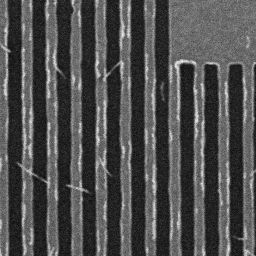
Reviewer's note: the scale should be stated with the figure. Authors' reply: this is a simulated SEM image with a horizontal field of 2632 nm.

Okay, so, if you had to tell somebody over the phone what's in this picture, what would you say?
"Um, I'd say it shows parallel lines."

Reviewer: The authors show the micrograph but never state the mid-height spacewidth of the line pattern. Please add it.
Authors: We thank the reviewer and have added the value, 0.155 µm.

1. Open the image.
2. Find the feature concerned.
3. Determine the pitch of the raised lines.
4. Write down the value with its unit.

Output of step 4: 252 nm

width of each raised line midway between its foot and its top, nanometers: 100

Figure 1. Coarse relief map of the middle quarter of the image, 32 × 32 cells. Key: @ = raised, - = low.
--@@----@@----@@----@@@---@@@---
--@@----@@----@@----@@@---@@@---
--@@----@@@---@@----@@@---@@@---
--@@----@@@---@@----@@@---@@@---
--@@----@@----@@-----@@---@@@---
--@@----@@-----@----@@----@@@---
--@@----@@----@@----@@----@@@---
--@@----@@----@@----@@----@@@---
--@@----@@----@@----@@----@@@---
--@@----@@----@@----@@----@@@---
--@@----@@----@@----@@-----@@---
--@@----@@----@@----@@-----@@---
--@@----@@----@@@---@@-----@@---
--@@----@@----@@@---@@@----@@---
--@@----@@----@@----@@@----@@---
--@@----@@----@@----@@@----@@---
--@@----@@----@@----@@-----@@---
--@@----@@----@@----@@-----@@---
--@@----@@----@@-----@@----@@---
--@@----@@----@@@----@@----@@---
--@@----@@-----@@----@@----@@---
--@@----@@-----@@---@@@----@@---
--@@----@@-----@----@@@----@@---
--@@----@@-----@@---@@@----@@---
--@@----@@-----@----@@@----@@---
--@@----@@----@@@---@@@----@@---
--@@----@@@---@@@---@@@----@@---
--@@----@@@---@@@----@@----@@---
--@@----@@@----@@----@@----@@---
--@@----@@@----@@----@@----@@---
-@@@----@@@----@@----@@---@@@---
--@@@---@@@----@@----@@---@@@---